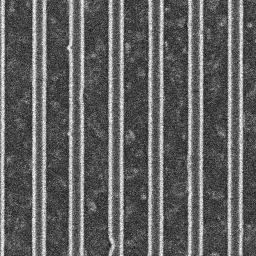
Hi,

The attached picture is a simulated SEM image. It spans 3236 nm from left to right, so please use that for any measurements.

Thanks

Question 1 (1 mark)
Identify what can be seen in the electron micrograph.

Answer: parallel lines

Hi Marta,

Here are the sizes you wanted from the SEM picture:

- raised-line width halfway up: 150 nm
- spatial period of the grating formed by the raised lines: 497 nm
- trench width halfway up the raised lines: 0.354 microns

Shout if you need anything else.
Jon